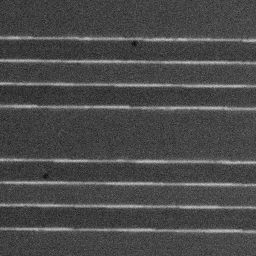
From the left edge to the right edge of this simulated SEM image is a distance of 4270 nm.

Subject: lines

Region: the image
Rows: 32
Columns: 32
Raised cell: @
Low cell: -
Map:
@@@@@@@@@@@@@@@@@@@@@@@@@@@@@@@@
@@@@@@@@@@@@@@@@@@@@@@@@@@@@@@@@
@@@@@@@@@@@@@@@@@@@@@@@@@@@@@@@@
@@@@@@@@@@@@@@@@@@@@@@@@@@@@@@@@
@@@@@@@@@@@@@@@@@@@@@@@@@@@@@@@@
--------------------------------
--------------------------------
--------------------------------
@@@@@@@@@@@@@@@@@@@@@@@@@@@@@@@@
@@@@@@@@@@@@@@@@@@@@@@@@@@@@@@@@
--------@@@@@@@@@@@@@@@@@@@@@@@@
--------------------------------
--------------------------------
@@@@@@@@@@@@@@@@@@@@------------
@@@@@@@@@@@@@@@@@@@@@@@@@@@@@@@@
@@@@@@@@@@@@@@@@@@@@@@@@@@@@@@@@
@@@@@@@@@@@@@@@@@@@@@@@@@@@@@@@@
@@@@@@@@@@@@@@@@@@@@@@@@@@@@@@@@
@@@@@@@@@@@@@@@@@@@@@@@@@@@@@@@@
@@@@@@@@@@@@@@@@@@@@@@@@@@@@@@@@
--------------------------------
--------------------------------
--------------------------------
@@@@@@@@@@@@@@@@@@@@@@@@@@@@@@@@
@@@@@@@@@@@@@@@@@@@@@@@@@@@@@@@@
@@@@@@@@@@@@@@@@@@@@@@@@@@@@@@@@
--------------------------------
--------------------------------
--------------------------------
@@@@@@@@@@@@@@@@@@@@@@@@@@@@@@@@
@@@@@@@@@@@@@@@@@@@@@@@@@@@@@@@@
@@@@@@@@@@@@@@@@@@@@@@@@@@@@@@@@